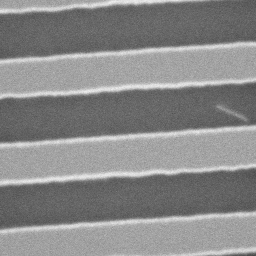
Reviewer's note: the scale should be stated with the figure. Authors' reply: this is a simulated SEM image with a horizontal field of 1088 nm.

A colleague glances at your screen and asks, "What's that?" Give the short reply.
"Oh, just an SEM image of lines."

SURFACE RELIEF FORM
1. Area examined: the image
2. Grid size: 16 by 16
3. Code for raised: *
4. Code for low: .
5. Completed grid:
*****...........
................
................
...*************
****************
*********.......
................
................
.......*********
****************
***************.
*...............
................
............****
****************
****************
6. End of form